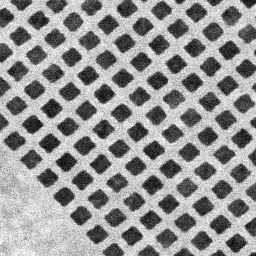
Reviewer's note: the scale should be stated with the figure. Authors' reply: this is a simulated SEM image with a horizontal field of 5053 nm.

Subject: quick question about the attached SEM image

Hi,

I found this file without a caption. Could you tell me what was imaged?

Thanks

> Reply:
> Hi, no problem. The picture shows a regular array of holes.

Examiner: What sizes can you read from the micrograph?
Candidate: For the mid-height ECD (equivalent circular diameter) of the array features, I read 385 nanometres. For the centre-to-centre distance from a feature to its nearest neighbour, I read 481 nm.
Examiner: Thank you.